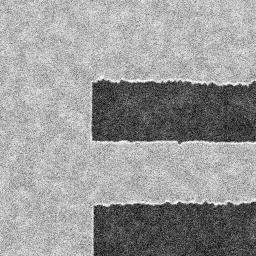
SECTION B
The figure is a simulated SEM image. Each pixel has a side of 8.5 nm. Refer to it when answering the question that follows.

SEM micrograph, one or a few lines or trenches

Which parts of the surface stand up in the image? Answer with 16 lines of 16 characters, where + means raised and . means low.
++++++++++++++++
++++++++++++++++
++++++++++++++++
++++++++++++++++
++++++++++++++++
++++++..........
++++++..........
++++++..........
++++++..........
++++++++++++++++
++++++++++++++++
++++++++++++++++
++++++++++++++++
++++++..........
++++++..........
++++++..........